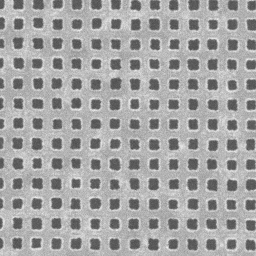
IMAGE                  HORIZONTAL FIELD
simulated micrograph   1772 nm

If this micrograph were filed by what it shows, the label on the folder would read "a regular array of holes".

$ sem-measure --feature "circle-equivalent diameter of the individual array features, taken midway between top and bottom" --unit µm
0.0859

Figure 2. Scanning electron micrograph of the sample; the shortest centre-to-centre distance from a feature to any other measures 133 nm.